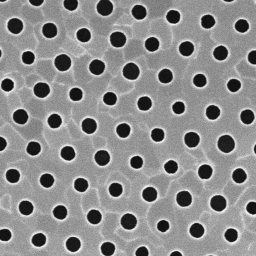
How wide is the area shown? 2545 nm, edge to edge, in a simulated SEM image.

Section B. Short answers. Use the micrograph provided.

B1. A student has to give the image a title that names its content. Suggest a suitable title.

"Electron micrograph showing a regular array of holes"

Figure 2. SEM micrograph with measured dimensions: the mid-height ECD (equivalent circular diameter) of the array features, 150 nanometers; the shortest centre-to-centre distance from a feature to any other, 340 nm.